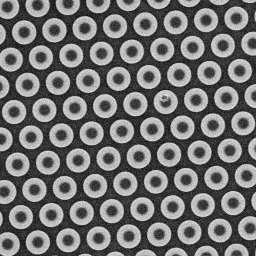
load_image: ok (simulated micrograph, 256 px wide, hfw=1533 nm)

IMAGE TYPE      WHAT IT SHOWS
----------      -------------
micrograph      an array of small figures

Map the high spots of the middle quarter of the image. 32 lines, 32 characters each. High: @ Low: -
-@@-----------------@@-----@@@@-
-----@@-----@@@@---@@@@@--@@@@@-
----@@@@---@@@@@--@@@@@@--@@@@@@
@--@@@@@@--@@@@@--@@@@@@--@@@@@@
@--@@@@@@--@@@@@---@@@@@--@@@@@-
@--@@@@@@--@@@@@---@@@@-----@@--
@---@@@@-----@@-----------------
----------------@@@----@@@@@---@
-@@@----@@@@---@@@@@---@@@@@--@@
@@@@@---@@@@@--@@@@@@--@@@@@--@@
@@@@@--@@@@@@--@@@@@@--@@@@@--@@
@@@@@@--@@@@@--@@@@@---@@@@@---@
@@@@@---@@@@----@@@@------------
-@@@-----------------@------@@@-
-------------@@@----@@@@---@@@@@
@----@@@@---@@@@@--@@@@@@--@@@@@
@@--@@@@@@--@@@@@--@@@@@@--@@@@@
@@--@@@@@@--@@@@@--@@@@@@--@@@@@
@@--@@@@@@--@@@@@---@@@@----@@@-
@@---@@@@----@@@----------------
@-----------------@@----@@@@---@
--@@@----@@@@---@@@@@---@@@@@--@
-@@@@@--@@@@@@--@@@@@@-@@@@@@--@
-@@@@@--@@@@@@--@@@@@@-@@@@@@--@
-@@@@@--@@@@@@--@@@@@---@@@@@---
-@@@@@---@@@@@---@@@-----@@-----
--@@@-----@@-----------------@@@
--------------@@@----@@@@---@@@@
@@----@@@@---@@@@@--@@@@@@--@@@@
@@@--@@@@@@-@@@@@@--@@@@@@--@@@@
@@@--@@@@@@-@@@@@@--@@@@@@--@@@@
@@@--@@@@@@--@@@@@---@@@@----@@@